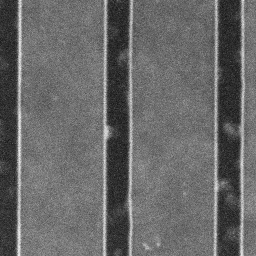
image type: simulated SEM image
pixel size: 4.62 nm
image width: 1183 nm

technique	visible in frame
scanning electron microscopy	one or a few lines or trenches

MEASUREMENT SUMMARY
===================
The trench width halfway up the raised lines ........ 390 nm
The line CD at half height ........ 125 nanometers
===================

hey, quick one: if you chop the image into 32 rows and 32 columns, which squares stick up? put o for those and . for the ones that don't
ooo..........ooo...........ooo..
ooo..........ooo...........ooo..
oo...........ooo...........ooo..
oo...........ooo...........ooo..
oo...........ooo...........ooo..
oo...........ooo...........ooo..
oo...........ooo...........ooo..
oo...........ooo...........ooo..
oo...........ooo...........ooo..
oo...........ooo...........ooo..
oo...........ooo...........oooo.
oo...........ooo...........ooo..
oo...........ooo...........ooo..
oo...........ooo...........ooo..
oo...........ooo...........ooo..
oo...........ooo...........ooo..
oo...........ooo...........ooo..
oo...........ooo...........ooo..
oo...........ooo...........ooo..
oo...........ooo...........ooo..
oo...........ooo...........ooo..
oo...........ooo...........ooo..
oo...........ooo...........ooo..
oo...........ooo...........ooo..
oo...........ooo...........ooo..
oo...........ooo...........ooo..
oo...........ooo...........ooo..
oo...........ooo...........ooo..
oo...........ooo...........ooo..
oo...........ooo...........ooo..
oo...........ooo...........ooo..
oo...........ooo...........ooo..